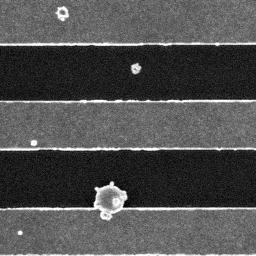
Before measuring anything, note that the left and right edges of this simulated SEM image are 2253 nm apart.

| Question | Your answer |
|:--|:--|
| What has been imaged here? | lines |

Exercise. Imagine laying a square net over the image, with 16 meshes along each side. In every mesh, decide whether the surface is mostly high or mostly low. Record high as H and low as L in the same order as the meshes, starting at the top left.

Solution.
HHHHHHHHHHHHHHHH
HHHHHHHHHHHHHHHH
HHHHHHHHHHHHHHHH
LLLLLLLLLLLLLLLL
LLLLLLLLLLLLLLLL
LLLLLLLLLLLLLLLL
HHHHHHHHHHHHHHHH
HHHHHHHHHHHHHHHH
HHHHHHHHHHHHHHHH
LLLLLLLLLLLLLLLL
LLLLLLLLLLLLLLLL
LLLLLLLLLLLLLLLL
LLLLLLHHLLLLLLLL
HHHHHHHHHHHHHHHH
HHHHHHHHHHHHHHHH
HHHHHHHHHHHHHHHH